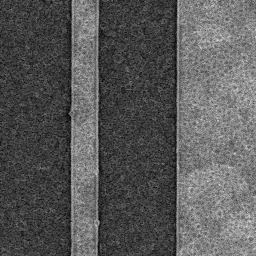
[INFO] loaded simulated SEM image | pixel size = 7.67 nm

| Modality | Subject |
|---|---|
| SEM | one or a few lines or trenches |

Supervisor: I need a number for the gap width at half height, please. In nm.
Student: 618